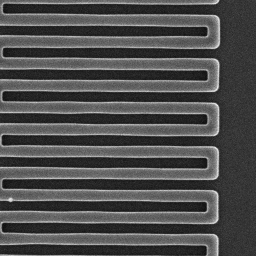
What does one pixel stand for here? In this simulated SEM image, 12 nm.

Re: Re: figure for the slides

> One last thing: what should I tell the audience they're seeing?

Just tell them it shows groups of lines, slits or small figures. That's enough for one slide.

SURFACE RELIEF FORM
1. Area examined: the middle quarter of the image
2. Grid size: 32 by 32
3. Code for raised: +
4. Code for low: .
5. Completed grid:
++++++++++++++++++++++++++++++++
................................
................................
................................
++++++++++++++++++++++++++++++++
++++++++++++++++++++++++++++++++
++++++++++++++++++++++++++++++++
................................
................................
++..............................
++++++++++++++++++++++++++++++++
++++++++++++++++++++++++++++++++
................................
................................
................................
++++++++++++++++++++++++++++++++
++++++++++++++++++++++++++++++++
++++++++++++++++++++++++++++++++
................................
................................
................................
++++++++++++++++++++++++++++++++
++++++++++++++++++++++++++++++++
................................
................................
................................
++++++++++++++++++++++++++++++++
++++++++++++++++++++++++++++++++
++++++++++++++++++++++++++++++++
................................
................................
................................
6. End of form